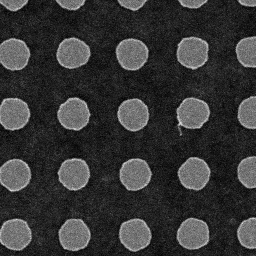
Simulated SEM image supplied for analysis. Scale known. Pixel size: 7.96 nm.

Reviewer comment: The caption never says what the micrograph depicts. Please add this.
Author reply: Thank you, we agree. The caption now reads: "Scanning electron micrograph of a regular array of raised bodies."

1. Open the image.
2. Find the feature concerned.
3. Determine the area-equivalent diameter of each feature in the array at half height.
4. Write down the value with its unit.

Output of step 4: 250 nm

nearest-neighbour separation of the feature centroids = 472 nanometers